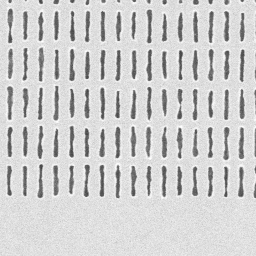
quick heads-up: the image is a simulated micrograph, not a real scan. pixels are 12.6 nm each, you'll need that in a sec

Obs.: a regular array of holes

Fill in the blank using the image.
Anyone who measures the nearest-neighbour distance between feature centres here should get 194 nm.